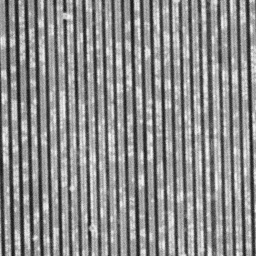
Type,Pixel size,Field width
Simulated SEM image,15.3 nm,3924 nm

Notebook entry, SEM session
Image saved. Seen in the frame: parallel lines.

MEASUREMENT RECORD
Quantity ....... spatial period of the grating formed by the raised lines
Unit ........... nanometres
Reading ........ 148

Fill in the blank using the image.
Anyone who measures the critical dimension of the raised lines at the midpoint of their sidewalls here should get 0.0747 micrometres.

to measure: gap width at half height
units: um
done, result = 0.0747